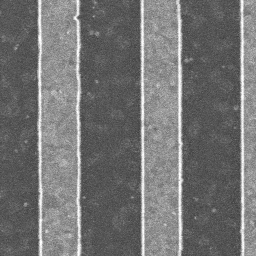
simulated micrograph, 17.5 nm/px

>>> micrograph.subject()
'one or a few lines or trenches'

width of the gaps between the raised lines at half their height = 1120 nm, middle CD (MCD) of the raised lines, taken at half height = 638 nm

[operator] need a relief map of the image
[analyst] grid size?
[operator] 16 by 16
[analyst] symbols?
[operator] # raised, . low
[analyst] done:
...##....##....#
...##....##....#
...##....##....#
...##....##....#
..###....##....#
...##....##....#
...##....##....#
..###....##....#
..###....##....#
...##....##....#
...##....##....#
...##....##....#
...##....##....#
...##....##....#
...##....##....#
...##....##....#